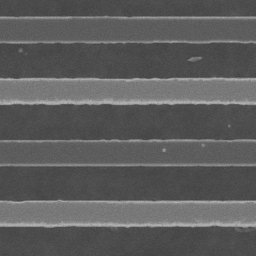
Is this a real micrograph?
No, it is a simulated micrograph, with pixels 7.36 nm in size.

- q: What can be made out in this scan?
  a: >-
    lines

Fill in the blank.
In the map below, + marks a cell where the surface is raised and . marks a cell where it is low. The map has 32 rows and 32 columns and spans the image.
................................
................................
++++++++++++++++++++++++++++++++
++++++++++++++++++++++++++++++++
++++++++++++++++++++++++++++++++
................................
................................
................................
................................
................................
++++++++++++++++++++++++++++++++
++++++++++++++++++++++++++++++++
++++++++++++++++++++++++++++++++
................................
................................
................................
................................
..............+.++++.++++++..+++
++++++++++++++++++++++++++++++++
++++++++++++++++++++++++++++++++
++++++++++++++++++++++++++++++++
................................
................................
................................
................................
++++++++++++++++++++++++++++++++
++++++++++++++++++++++++++++++++
++++++++++++++++++++++++++++++++
................................
................................
................................
................................